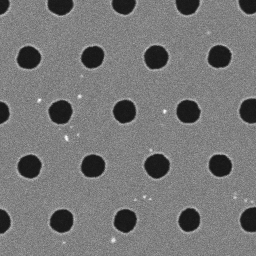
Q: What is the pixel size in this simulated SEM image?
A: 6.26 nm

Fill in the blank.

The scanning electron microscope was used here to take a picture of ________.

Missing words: a regular array of holes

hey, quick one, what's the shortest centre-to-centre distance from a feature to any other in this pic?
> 394 nm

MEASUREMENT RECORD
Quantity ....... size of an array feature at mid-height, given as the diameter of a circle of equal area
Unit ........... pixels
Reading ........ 23.8